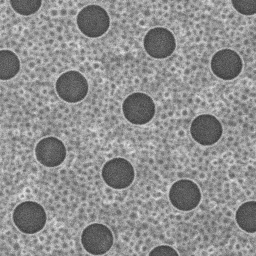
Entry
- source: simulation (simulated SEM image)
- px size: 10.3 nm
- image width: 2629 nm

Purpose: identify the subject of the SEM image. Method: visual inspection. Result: a regular array of holes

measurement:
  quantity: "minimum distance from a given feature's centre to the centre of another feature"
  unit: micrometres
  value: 0.704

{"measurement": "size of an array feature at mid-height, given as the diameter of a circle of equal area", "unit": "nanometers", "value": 338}